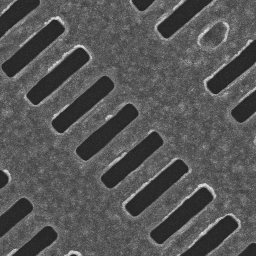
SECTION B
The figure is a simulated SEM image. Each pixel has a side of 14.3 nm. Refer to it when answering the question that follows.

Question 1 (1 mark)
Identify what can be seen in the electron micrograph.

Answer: holes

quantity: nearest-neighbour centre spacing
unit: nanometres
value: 531